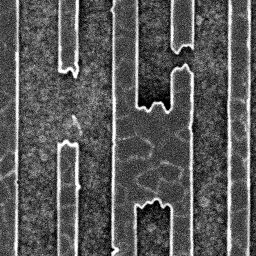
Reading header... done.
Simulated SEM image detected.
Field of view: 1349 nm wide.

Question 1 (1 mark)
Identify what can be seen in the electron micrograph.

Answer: parallel lines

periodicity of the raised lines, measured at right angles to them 298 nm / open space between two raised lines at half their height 184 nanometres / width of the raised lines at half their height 114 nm